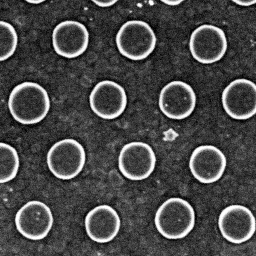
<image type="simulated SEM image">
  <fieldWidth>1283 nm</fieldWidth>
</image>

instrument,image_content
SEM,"a regular array of raised bodies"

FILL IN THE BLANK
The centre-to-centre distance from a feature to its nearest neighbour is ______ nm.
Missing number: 330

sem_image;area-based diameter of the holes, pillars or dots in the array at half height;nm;179